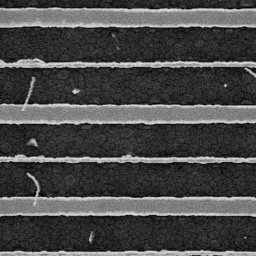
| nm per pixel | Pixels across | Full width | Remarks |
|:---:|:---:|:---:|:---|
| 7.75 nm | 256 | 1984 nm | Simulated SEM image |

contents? lines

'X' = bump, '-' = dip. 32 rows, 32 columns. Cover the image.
--------------------------------
XXXXXXXXXXXXXXXXXXXXXXXXXXXXXXXX
XXXXXXXXXXXXXXXXXXXXXXXXXXXXXXXX
--------------------------------
--------------------------------
--------------------------------
--------------------------------
--------------------------------
--------------------------------
--------------------------------
--------------------------------
--------------------------------
--------------------------------
XXXXXXXXXXXXXXXXXXXXXXXXXXXXXXXX
XXXXXXXXXXXXXXXXXXXXXXXXXXXXXXXX
--------------------------------
--------------------------------
--------------------------------
--------------------------------
--------------------------------
--------------------------------
--------------------------------
--------------------------------
--------------------------------
--------------------------------
XXXXXXXXXXXXXXXXXXXXXXXXXXXXXXXX
XXXXXXXXXXXXXXXXXXXXXXXXXXXXXXXX
--------------------------------
--------------------------------
--------------------------------
--------------------------------
----------------X---------------